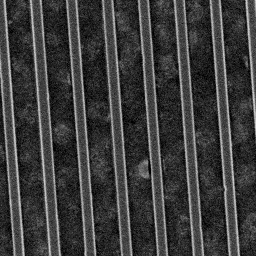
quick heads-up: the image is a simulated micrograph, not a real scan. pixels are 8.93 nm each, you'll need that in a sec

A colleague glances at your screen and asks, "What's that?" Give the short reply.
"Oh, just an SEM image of parallel lines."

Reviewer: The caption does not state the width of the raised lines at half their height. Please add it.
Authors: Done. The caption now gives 90.1 nanometres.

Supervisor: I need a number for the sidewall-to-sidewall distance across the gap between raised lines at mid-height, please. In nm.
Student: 228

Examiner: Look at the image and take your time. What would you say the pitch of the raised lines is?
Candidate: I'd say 320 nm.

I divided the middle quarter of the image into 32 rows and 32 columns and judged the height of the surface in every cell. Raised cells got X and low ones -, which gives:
--XX-------XX-------XX-------XX-
--XX-------XX-------XX-------XX-
--XXX------XX-------XX-------XX-
--XXX------XXX------XX-------XXX
--XXX------XXX------XX-------XXX
--XXX------XXX------XXX------XXX
---XX------XXX------XXX------XXX
---XX------XXX------XXX------XXX
---XX-------XX------XXX------XXX
---XX-------XX-------XX------XXX
---XX-------XX-------XX-------XX
---XX-------XX-------XX-------XX
---XX-------XX-------XX-------XX
---XX-------XX-------XX-------XX
---XX-------XX-------XX-------XX
---XX-------XX-------XX-------XX
---XXX------XX-------XX-------XX
---XXX------XXX------XX-------XX
---XXX------XXX------XXX------XX
---XXX------XXX------XXX------XX
---XXX------XXX------XXX------XX
---XXX-------XX------XXX------XX
---XXX-------XX-------XX------XX
----XX-------XX-------XX-------X
----XX-------XX-------XX-------X
----XX-------XX-------XX-------X
----XX-------XX-------XX-------X
----XX-------XX-------XX-------X
----XX-------XX-------XX-------X
----XXX------XX-------XX-------X
----XXX------XXX------XX-------X
----XXX------XXX------XXX------X